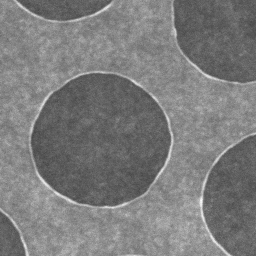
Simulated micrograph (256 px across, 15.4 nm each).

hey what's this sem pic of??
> holes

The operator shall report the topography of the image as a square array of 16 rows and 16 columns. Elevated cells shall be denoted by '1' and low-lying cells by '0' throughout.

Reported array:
1100000111100000
1111111111100000
1111111111100000
1111111111110000
1111111111111000
1111000001111111
1110000000111111
1100000000111111
1100000000011111
1100000000011100
1100000000111000
1110000001111000
1111000011111000
1111111111111000
0111111111111000
0011111111111100